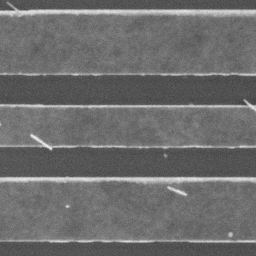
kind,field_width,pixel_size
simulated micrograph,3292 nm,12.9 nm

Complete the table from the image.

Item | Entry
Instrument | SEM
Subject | lines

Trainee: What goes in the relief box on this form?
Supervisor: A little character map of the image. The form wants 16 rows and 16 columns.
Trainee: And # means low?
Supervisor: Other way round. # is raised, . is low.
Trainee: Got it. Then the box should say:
................
################
################
################
################
................
................
################
################
................
................
################
################
################
################
................